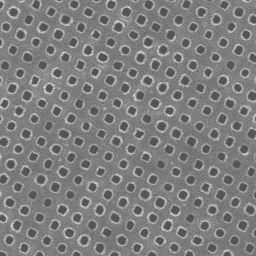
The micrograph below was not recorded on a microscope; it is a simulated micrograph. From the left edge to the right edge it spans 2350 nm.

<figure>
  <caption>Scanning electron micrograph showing a regular array of holes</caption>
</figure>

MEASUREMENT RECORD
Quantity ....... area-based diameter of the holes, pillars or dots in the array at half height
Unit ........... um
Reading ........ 0.0725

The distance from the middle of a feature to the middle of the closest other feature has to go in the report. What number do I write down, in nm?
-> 152